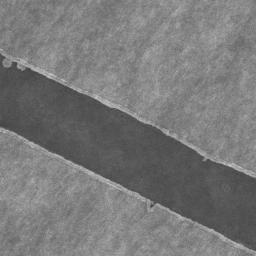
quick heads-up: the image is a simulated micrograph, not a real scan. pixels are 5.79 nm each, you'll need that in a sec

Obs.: one or a few lines or trenches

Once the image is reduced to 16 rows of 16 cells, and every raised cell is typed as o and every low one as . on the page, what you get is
oooooooooooooooo
oooooooooooooooo
oooooooooooooooo
oooooooooooooooo
..oooooooooooooo
.....ooooooooooo
.......ooooooooo
.........ooooooo
o..........ooooo
ooo.........oooo
ooooo..........o
ooooooo.........
ooooooooo.......
ooooooooooo.....
ooooooooooooo...
ooooooooooooooo.